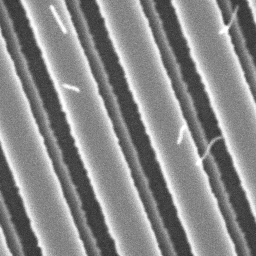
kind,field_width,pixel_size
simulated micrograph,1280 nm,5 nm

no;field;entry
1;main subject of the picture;lines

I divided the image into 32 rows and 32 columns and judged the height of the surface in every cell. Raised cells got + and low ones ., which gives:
...+++++....++++++....+++++....+
...++++++....+++++....++++++....
....+++++....+++++....++++++....
....+++++....++++++....+++++....
....++++++....+++++....++++++...
+....+++++....+++++.....+++++...
+....+++++.....+++++....+++++...
+.....+++++....+++++....++++++..
++....+++++....++++++....+++++..
++....++++++....+++++....+++++..
+++....+++++....+++++.....+++++.
+++....+++++....++++++....+++++.
+++.....+++++....+++++....++++++
++++....+++++....+++++.....+++++
++++....++++++....+++++....+++++
+++++....+++++....+++++....+++++
+++++....+++++....++++++....++++
+++++....++++++....+++++....++++
++++++....+++++....++++++...++++
.+++++....+++++.....+++++....+++
.++++++....+++++....+++++....+++
..+++++....+++++....++++++....++
..+++++....++++++....+++++....++
..++++++....+++++....+++++....++
...+++++....+++++.....+++++....+
...+++++.....+++++....+++++....+
...++++++....+++++....+++++.....
....+++++....++++++....+++++....
....+++++.....+++++....+++++....
.....+++++....+++++....++++++...
+....+++++.....+++++....+++++...
+....++++++....+++++....+++++...